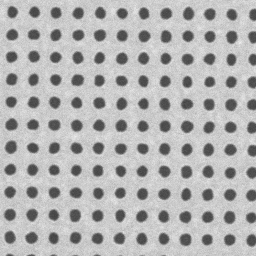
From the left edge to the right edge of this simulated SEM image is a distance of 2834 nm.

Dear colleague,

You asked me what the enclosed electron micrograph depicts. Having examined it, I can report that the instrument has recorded a regular array of holes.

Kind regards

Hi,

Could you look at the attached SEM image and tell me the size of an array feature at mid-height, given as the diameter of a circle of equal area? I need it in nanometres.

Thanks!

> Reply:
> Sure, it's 138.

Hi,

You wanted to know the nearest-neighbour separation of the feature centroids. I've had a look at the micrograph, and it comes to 241 nm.